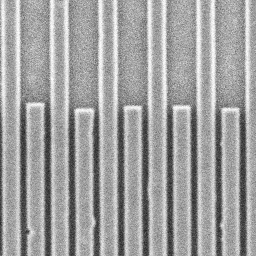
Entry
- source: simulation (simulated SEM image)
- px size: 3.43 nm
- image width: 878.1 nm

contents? parallel lines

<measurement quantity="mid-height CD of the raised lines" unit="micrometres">0.0548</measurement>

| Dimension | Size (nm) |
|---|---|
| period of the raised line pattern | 83.6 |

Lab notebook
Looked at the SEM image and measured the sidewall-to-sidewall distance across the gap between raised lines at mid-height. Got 29.1 nanometres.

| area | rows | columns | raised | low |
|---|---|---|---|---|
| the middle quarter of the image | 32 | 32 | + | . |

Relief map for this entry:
+........++++........++++.......
+........++++........++++.......
+........++++........++++.......
+........++++........++++.......
+........++++........++++.......
+........++++........++++.......
+........++++........++++.......
+........++++........++++.......
+........++++........++++.......
+........++++........++++.......
+........++++........++++.......
+........++++..++++..++++...+++.
+..++++..++++..++++..++++...+++.
+..++++..++++..++++..++++...+++.
+..++++..++++...+++..++++...+++.
+..++++..++++...+++..++++...+++.
+..++++..++++...+++..++++...+++.
+..++++..++++...+++..++++...+++.
+..++++..++++...+++..++++...+++.
+..++++..++++...+++..++++...+++.
+..++++..++++...+++..++++...+++.
+..++++..++++...+++..++++...+++.
+..++++..++++...+++..++++...+++.
+..++++..++++...+++..++++...+++.
+..++++..++++...+++..++++...+++.
+..++++..++++...+++..++++...+++.
+..++++..++++...+++..++++...+++.
+..++++..++++...+++..++++...+++.
+..++++..++++...+++..++++...+++.
+..++++..++++...+++..++++...+++.
+..++++..++++...+++..++++...+++.
+..++++..++++...+++..++++...+++.